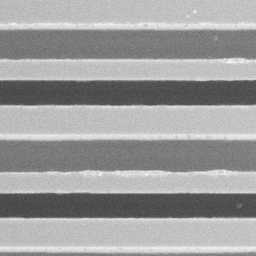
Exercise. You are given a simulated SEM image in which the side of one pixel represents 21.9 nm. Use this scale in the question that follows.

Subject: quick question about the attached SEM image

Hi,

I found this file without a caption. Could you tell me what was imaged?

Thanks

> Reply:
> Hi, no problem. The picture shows lines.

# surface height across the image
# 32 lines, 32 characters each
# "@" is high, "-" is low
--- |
@@@@@@@@@@@@@@@@@@@@@@@@@@@@@@@@
@@@@@@@@@@@@@@@@@@@@@@@@@@@@@@@@
@@@@@@@@@@@@@@@@@@@@@@@@@@@@@@@@
--------------------------------
--------------------------------
--------------------------------
--------------------------------
---------@@@--------------@@@@@@
@@@@@@@@@@@@@@@@@@@@@@@@@@@@@@@@
@@@@@@@@@@@@@@@@@@@@@@@@@@@@@@@@
--------------------------------
--------------------------------
--------------------------------
@@@@@@@@@@@@@@@@@@@@@@@@@@@@@@@@
@@@@@@@@@@@@@@@@@@@@@@@@@@@@@@@@
@@@@@@@@@@@@@@@@@@@@@@@@@@@@@@@@
@@@@@@@@@@@@@@@@@@@@@@@@@@@@@@@@
--------------------------------
--------------------------------
--------------------------------
--------------------------------
----------@@@-@@@@@@@-----@@@---
@@@@@@@@@@@@@@@@@@@@@@@@@@@@@@@@
@@@@@@@@@@@@@@@@@@@@@@@@@@@@@@@@
--------------------------------
--------------------------------
--------------------------------
@@@@@@@@@@@@@@@@@@@@@@@@@@@@@@@@
@@@@@@@@@@@@@@@@@@@@@@@@@@@@@@@@
@@@@@@@@@@@@@@@@@@@@@@@@@@@@@@@@
@@@@@@@@@@@@@@@@@@@@@@@@@@@@@@@@
--------------------------------